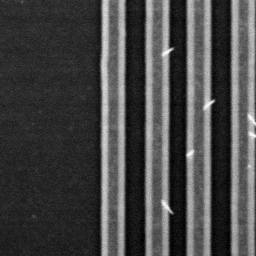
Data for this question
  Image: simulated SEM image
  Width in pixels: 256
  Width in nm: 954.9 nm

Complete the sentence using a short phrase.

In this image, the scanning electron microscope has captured parallel lines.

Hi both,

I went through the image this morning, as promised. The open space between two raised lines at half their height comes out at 100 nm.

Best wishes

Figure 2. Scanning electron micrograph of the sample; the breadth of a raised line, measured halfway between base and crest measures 64.9 nm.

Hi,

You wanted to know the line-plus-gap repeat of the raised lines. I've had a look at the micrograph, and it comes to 162 nm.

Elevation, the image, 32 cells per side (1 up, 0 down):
00000000000001100001100011000110
00000000000001100001100011000110
00000000000001100001100011000110
00000000000001100001100011000110
00000000000001100001100011000110
00000000000001100001100011000110
00000000000001100001100011000110
00000000000001100001100011000110
00000000000001100001100011000110
00000000000001100001100011000110
00000000000001100001100011000110
00000000000001100001100011000110
00000000000001100001100011000110
00000000000001100001100011000110
00000000000001100001100011000111
00000000000001100001100011000111
00000000000001100001100011000111
00000000000001100001100011000111
00000000000001100001100011000110
00000000000001100001100011000110
00000000000001100001100011000110
00000000000001100001100011000110
00000000000001100001100011000110
00000000000001100001100011000110
00000000000001100001100011000110
00000000000001100001100011000110
00000000000001100001100011000110
00000000000001100001100011000110
00000000000001100001100011000110
00000000000001100001100011000110
00000000000001100001100011000110
00000000000001100001100011000110